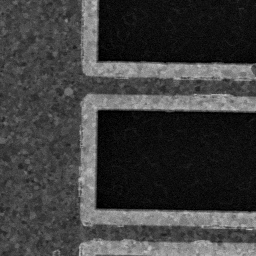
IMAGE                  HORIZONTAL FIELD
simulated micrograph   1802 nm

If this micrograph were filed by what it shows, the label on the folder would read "one or a few lines or trenches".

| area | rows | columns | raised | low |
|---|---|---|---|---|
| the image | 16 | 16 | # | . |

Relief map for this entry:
######..........
######..........
######..........
######..........
################
################
######....#..###
######..........
######..........
######..........
######..........
######..........
######..........
######..........
################
################